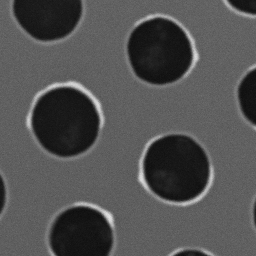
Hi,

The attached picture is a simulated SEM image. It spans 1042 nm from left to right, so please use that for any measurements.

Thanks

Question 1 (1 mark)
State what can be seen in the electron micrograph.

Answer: holes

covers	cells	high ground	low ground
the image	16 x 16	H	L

HLLLLHHHHHHHHHHL
HLLLLHHHHLLHHHHH
HHLHHHHHLLLLHHHH
HHHHHHHHLLLLHHHH
HHHHHHHHLLLLHHHH
HHHHLHHHHHHHHHHL
HHLLLLHHHHHHHHHL
HHLLLLHHHHHHHHHH
HHLLLLHHHHLLHHHH
HHHLLHHHHLLLLHHH
HHHHHHHHHLLLLHHH
HHHHHHHHHLLLLHHH
HHHHHHHHHHLLHHHH
HHHHLLHHHHHHHHHH
HHHLLLLHHHHHHHHH
HHHLLLLHHHHHHHHH